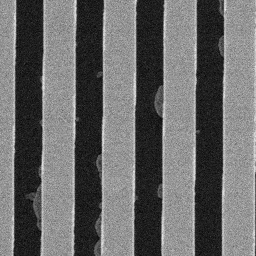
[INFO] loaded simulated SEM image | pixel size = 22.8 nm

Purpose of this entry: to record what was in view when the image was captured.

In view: lines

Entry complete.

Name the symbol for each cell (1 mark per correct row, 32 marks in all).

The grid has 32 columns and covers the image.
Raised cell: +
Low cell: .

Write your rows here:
++....+++....++++....+++....++++
++....+++....++++....+++....++++
++....+++....++++....+++....++++
++....+++....++++....+++....++++
++....+++....++++....+++....++++
++....+++....++++....+++....++++
++....+++....++++....+++....++++
++...++++....++++....+++....++++
++...++++....++++....+++....++++
++...++++....++++....+++....++++
++...++++....++++....+++....++++
++...++++....++++....+++....++++
++...++++....++++...++++....++++
++...++++....++++...++++....++++
++...++++....++++...++++....++++
++...++++....++++...++++....++++
++...++++....++++...++++....++++
++...++++....++++...++++....++++
++...++++....++++...++++....++++
++...++++....++++...++++....++++
++...++++....++++...++++....++++
++...++++....++++...++++....++++
++...++++....++++...++++....++++
++...++++....++++...++++....++++
++...++++....++++...++++....++++
++...++++....++++...++++....++++
++...++++....++++...++++....++++
++...++++....++++...++++....++++
++...++++....++++...++++....++++
++...++++....++++...++++....++++
++...++++....++++...++++....++++
++...++++....++++...++++....++++